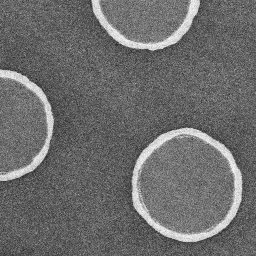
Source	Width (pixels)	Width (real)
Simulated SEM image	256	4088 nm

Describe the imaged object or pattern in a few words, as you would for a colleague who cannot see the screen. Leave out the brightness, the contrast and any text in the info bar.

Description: raised bodies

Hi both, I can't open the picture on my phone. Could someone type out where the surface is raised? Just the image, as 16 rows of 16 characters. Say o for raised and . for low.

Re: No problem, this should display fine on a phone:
......oooooo....
.......ooooo....
........ooo.....
................
................
oo..............
ooo.............
ooo.............
ooo........oo...
ooo......ooooo..
oo.......oooooo.
........ooooooo.
........ooooooo.
.........ooooo..
..........ooo...
................